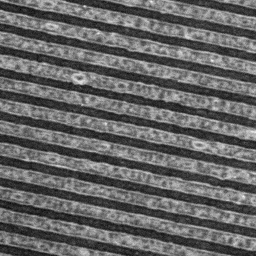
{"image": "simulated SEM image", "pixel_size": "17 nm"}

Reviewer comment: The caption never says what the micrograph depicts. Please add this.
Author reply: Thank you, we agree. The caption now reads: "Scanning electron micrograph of parallel lines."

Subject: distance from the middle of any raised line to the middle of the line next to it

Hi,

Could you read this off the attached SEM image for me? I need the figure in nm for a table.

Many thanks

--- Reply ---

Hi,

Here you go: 366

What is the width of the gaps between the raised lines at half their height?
158 nanometres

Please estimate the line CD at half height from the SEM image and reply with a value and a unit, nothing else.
0.204 microns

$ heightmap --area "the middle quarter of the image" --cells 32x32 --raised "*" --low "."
...........**************.......
**.............**************...
********............************
************..............******
..***************..............*
.......****************.........
............***************.....
****.............***************
**********...........***********
***************............*****
......*************............*
..........***************.......
***............***************..
********............************
*************.............******
...***************...........***
........***************.........
*............***************....
*****.............**************
***********............*********
***************.............****
.....**************.............
..........***************.......
**.............**************...
*******..............***********
************............********
..***************..............*
.........*************..........
............****************....
*****............***************
**********............**********
.**************.............****